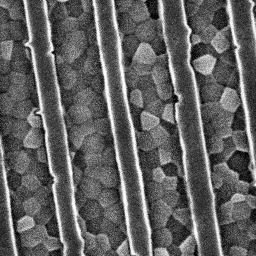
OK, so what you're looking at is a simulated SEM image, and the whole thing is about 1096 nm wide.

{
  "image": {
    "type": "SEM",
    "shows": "one or a few lines or trenches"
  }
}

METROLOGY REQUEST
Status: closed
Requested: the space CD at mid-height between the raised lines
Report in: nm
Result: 199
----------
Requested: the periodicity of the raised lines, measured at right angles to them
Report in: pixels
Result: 67.4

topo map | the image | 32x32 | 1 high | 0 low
00011100000011000000111000000111
00011100000011000000111000000110
00011100000011000000111000000111
00001100000011100000111100000111
00001100000011100000011100000111
00001100000011100000011100000011
00001100000001100000011100000011
00001110000001100000011100000011
00001110000001100000011100000011
00001110000001100000011100000011
00000110000001110000001100000011
00000110000001110000001110000011
00000110000000110000001110000011
00000111000000110000001110000001
00000111000000110000001110000001
00000011000000110000001110000001
00000011000000111000001110000001
00000011000000111000000110000001
00000011000000011000000111000001
00000011100000011000000111000000
00000011100000011000000111000000
10000011100000011000000111000000
10000001100000011100000111000000
10000001100000011100000111000000
10000001100000001100000011100000
10000001100000001100000011100000
10000001100000001100000011100000
10000001110000001100000011100000
11000001110000001110000011100000
11000000110000001110000011100000
11000000110000001110000001100000
11000000110000000110000001110000